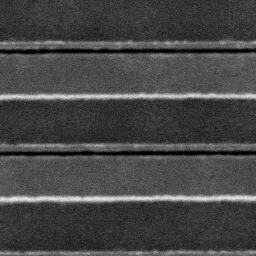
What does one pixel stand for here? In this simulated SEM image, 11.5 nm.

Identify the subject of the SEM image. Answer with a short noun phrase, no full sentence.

lines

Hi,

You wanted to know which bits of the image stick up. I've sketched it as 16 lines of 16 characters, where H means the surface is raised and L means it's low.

LLLLLLLLLLLLLLLL
LLLLLLLLLLLLLLLL
LLLLLLLLLLLLLLLL
HHHHHHHHHHHHHHHH
HHHHHHHHHHHHHHHH
HHHHHHHHHHHHHHHH
LLLLLLLLLLLLLLLL
LLLLLLLLLLLLLLLL
LLLLLLLLLLLLLLLL
HHHHHHHHHHHHHHHH
HHHHHHHHHHHHHHHH
HHHHHHHHHHHHHHHH
LLLLLLLLLLLLLLLL
LLLLLLLLLLLLLLLL
LLLLLLLLLLLLLLLL
LLLLLLLLLLLLLLLL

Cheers